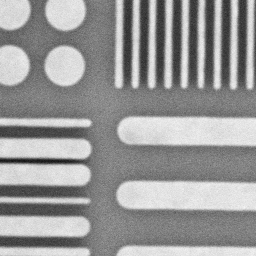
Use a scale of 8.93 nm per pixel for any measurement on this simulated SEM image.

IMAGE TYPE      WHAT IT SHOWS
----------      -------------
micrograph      groups of lines, slits or small figures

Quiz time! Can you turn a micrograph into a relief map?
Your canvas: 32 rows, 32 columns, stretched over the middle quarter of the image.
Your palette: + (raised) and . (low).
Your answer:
+++++........++..++..++..++..++.
+++++........++..++..++..++..++.
++++.........++..++..++..++..++.
++++.........++..++..++..++..++.
+++..........++..+...++..++..++.
.............+...+...++..++..++.
................................
................................
................................
................................
................................
................................
................................
................................
+++++++.......++++++++++++++++++
+++.++........++++++++++++++++++
..............++++++++++++++++++
..............++++++++++++++++++
..............++++++++++++++++++
++++++.........+++++++++++++++++
+++++++.........................
+++++++.........................
++++++..........................
+++++...........................
................................
+++++...........................
++++++..........................
++++++..........................
++++++..........................
++++++..........................
..............++++++++++++++++++
..............++++++++++++++++++